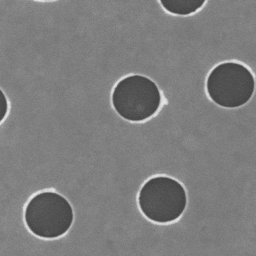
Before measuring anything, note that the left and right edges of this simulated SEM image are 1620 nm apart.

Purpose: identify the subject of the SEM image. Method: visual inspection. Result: holes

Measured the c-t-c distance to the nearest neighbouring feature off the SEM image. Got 0.633 microns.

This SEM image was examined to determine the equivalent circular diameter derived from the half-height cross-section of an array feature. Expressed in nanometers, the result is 296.